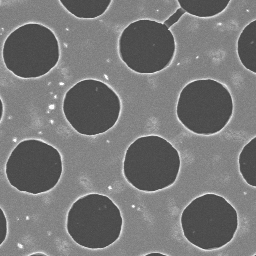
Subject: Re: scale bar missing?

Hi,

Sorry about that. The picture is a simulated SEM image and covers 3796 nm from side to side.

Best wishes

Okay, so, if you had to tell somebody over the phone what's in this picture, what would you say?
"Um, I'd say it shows holes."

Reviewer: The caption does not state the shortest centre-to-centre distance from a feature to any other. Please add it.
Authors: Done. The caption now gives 1210 nm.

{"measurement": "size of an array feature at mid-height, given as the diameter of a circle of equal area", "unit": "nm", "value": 821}